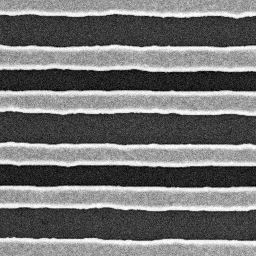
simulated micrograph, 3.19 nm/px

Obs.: lines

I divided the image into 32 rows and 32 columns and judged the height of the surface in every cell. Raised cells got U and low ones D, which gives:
UUUUUUUUUUUUUUUUUUUUUUUUUUUUUUUU
UUUUUUUUUUUUUUUUUUUUUUUUUUUUUUUU
DDDDDDDDDDDDDDDDDDDDDDDDDDDDDDDD
DDDDDDDDDDDDDDDDDDDDDDDDDDDDDDDD
DDDDDDDDDDDDDDDDDDDDDDDDDDDDDDDD
DDDDDDDDDDDDDDDDDDDDDDDDDDDDDDDD
UUUUUUUUUUUUUUUUUUUUUUUUUUUUUUUU
UUUUUUUUUUUUUUUUUUUUUUUUUUUUUUUU
UUUUUUUUUUUUUUUUUUUUUUUUUUUUUUUU
DDDDDDDDDDDDDDDDDDDDDDDDDDDDDDDD
DDDDDDDDDDDDDDDDDDDDDDDDDDDDDDDD
UUUUUUUUUUUUUUUUUUUUUUUUUUUUUUUU
UUUUUUUUUUUUUUUUUUUUUUUUUUUUUUUU
UUUUUUUUUUUUUUUUUUUUUUUUUUUUUUUU
DDDDDDDDDDDDDDDDDDDDDDDDDDDDDDDD
DDDDDDDDDDDDDDDDDDDDDDDDDDDDDDDD
DDDDDDDDDDDDDDDDDDDDDDDDDDDDDDDD
DDDDDDDDDDDDDDDDDDDDDDDDDDDDDDDD
UUUUUUUUUUUUUUUUUUUUUUUUUUUUUUUU
UUUUUUUUUUUUUUUUUUUUUUUUUUUUUUUU
DUUUUUUUUUUUUUUUUUUUUUUUUUUUUUUU
DDDDDDDDDDDDDDDDDDDDDDDDDDDDDDDD
DDDDDDDDDDDDDDDDDDDDDDDDDDDDDDDD
UUUUUUUUUUUUUUUUUUUUUDDDDUDDDUUU
UUUUUUUUUUUUUUUUUUUUUUUUUUUUUUUU
UUUUUUUUUUUUUUUUUUUUUUUUUUUUUUUU
DDDDDDDDDDDDDDDDDDDDDDDDDDDDDDDD
DDDDDDDDDDDDDDDDDDDDDDDDDDDDDDDD
DDDDDDDDDDDDDDDDDDDDDDDDDDDDDDDD
DDDDDDDDDDDDDDDDDDDDDDDDDDDDDDDD
UUUUUUUUUUUUUUUUUUUUUUUUUUUUUUUU
UUUUUUUUUUUUUUUUUUUUUUUUUUUUUUUU